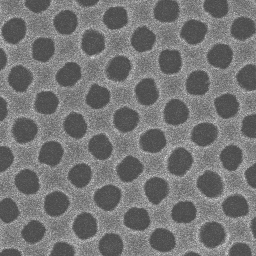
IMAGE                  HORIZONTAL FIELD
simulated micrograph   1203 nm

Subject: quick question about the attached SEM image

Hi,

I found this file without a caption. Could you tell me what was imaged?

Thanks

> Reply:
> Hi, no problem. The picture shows a regular array of holes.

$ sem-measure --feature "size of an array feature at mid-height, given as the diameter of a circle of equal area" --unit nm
119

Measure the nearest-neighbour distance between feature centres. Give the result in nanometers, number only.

164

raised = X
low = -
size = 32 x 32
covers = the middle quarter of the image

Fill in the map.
----XXXXXXX------XXXXXXX-----XXX
----XXXXXX-------XXXXXXX-----XXX
----XXXXXXX-----XXXXXXXXXX-XXXXX
----XXXXXXX-----XXXX-XXXXXXXXXX-
---XXXXXXXXXXXXXXXX----XXXXXXX--
--XXXXX--XXXXXXXXX-----XXXXXXX--
XXXXXX-----XXXXXXX-----XXXXXXX--
XXXXXX------XXXXXX------XXXXXXX-
XXXXX------XXXXXXX------XXXXXXXX
XXXXX------XXXXXXXX----XXX----XX
XXXXXX----XXXXX-XXXX-XXXX------X
XXXXXXXXXXXXX-----XXXXXXX------X
X---XXXXXXXX-------XXXXXX------X
-----XXXXXXX-------XXXXXX------X
-----XXXXXXX-------XXXXXX------X
------XXXXXXX-----XXXXXXXXXXXXXX
------XXXXXXXX---XXXX---XXXXXXXX
X----XXXX-XXXXXXXXXX-----XXXXXXX
XX--XXX----XXXXXXXX------XXXXXXX
XXXXXX------XXXXXXX-------XXXXXX
XXXXXX------XXXXXXX------XXXXXXX
XXXXXX------XXXXXXXX----XXXX---X
XXXXXXX-----XXXXXXXXXXXXXXX-----
XXXXXXXX---XXXX---XXXXXXXX------
XXXXXXXXXXXXXX-----XXXXXXX------
XXX---XXXXXXX-------XXXXXX------
X------XXXXXX-------XXXXXX-----X
X------XXXXXX------XXXXXXXX---XX
X------XXXXXXX----XXXX--XXXXXXXX
X-----XXXXXXXXX--XXXX-----XXXXXX
XX----XXXX---XXXXXXX------XXXXXX
XXXXXXXX------XXXXXX------XXXXXX